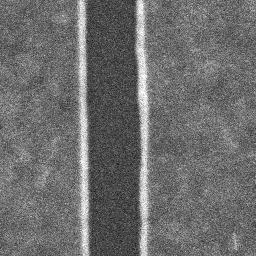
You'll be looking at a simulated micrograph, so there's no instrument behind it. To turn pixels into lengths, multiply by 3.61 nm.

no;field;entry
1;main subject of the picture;one or a few lines or trenches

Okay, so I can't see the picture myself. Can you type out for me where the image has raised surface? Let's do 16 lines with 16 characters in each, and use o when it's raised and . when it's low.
ooooo....ooooooo
ooooo....ooooooo
ooooo....ooooooo
ooooo....ooooooo
ooooo....ooooooo
ooooo....ooooooo
ooooo....ooooooo
ooooo....ooooooo
ooooo....ooooooo
ooooo....ooooooo
ooooo....ooooooo
ooooo....ooooooo
ooooo....ooooooo
ooooo....ooooooo
ooooo....ooooooo
ooooo....ooooooo